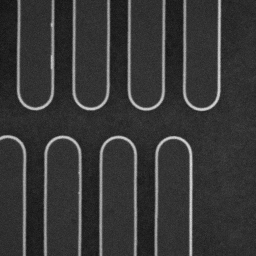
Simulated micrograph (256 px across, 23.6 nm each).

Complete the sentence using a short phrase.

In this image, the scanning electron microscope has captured groups of lines, slits or small figures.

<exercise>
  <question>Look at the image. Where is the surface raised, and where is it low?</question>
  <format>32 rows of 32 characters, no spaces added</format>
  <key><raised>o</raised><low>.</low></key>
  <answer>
..ooooo..ooooo..oooo...oooo.....
..ooooo..ooooo..oooo...oooo.....
..ooooo..ooooo..oooo...oooo.....
..ooooo..ooooo..oooo...oooo.....
..ooooo..ooooo..oooo...oooo.....
..ooooo..ooooo..oooo...oooo.....
..ooooo..ooooo..oooo...oooo.....
..ooooo..ooooo..oooo...oooo.....
..ooooo..ooooo..oooo...oooo.....
..ooooo..ooooo..oooo...oooo.....
..ooooo..ooooo..oooo...oooo.....
..ooooo..ooooo..oooo...oooo.....
...ooo....ooo...oooo...oooo.....
....o......o......o.....oo......
................................
................................
................................
oo.....oo.....oo.....oo.........
ooo...oooo...oooo...oooo........
ooo...oooo...oooo...oooo........
ooo...oooo...oooo...oooo........
ooo...oooo...oooo...oooo........
ooo...oooo...oooo...oooo........
ooo...oooo...oooo...oooo........
ooo...oooo...oooo...oooo........
ooo...oooo...oooo...oooo........
ooo...oooo...oooo...oooo........
ooo...oooo...oooo...oooo........
ooo...oooo...oooo...oooo........
ooo...oooo...oooo..ooooo........
ooo...oooo...oooo..ooooo........
ooo...oooo...oooo...oooo........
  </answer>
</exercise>